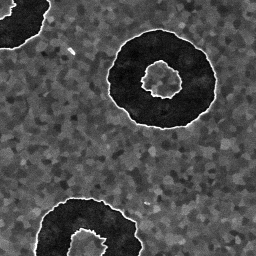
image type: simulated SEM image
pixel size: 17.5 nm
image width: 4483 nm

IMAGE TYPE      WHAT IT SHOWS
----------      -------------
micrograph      ring-shaped grooves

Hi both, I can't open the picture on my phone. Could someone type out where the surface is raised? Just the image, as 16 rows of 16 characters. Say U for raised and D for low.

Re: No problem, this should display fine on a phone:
UDDUUUUUUUUUUUUU
DDDUUUUUUUUUUUUU
DDUUUUUUDDDDUUUU
UUUUUUUDDDDDDUUU
UUUUUUUDDUUDDUUU
UUUUUUUDDUUDDUUU
UUUUUUUDDDDDDUUU
UUUUUUUUDDDDUUUU
UUUUUUUUUUUUUUUU
UUUUUUUUUUUUUUUU
UUUUUUUUUUUUUUUU
UUUUUUUUUUUUUUUU
UUUUDDUUUUUUUUUU
UUUDDDDDUUUUUUUU
UUDDDUDDDUUUUUUU
UUDDUUDDDUUUUUUU